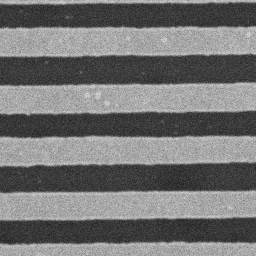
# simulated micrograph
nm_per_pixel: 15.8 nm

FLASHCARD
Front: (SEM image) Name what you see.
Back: lines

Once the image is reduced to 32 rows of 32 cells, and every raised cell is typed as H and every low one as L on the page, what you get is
LLLLLLLLLLLLLLLLLLLLLLLLLLLLLLLL
LLLLLLLLLLLLLLLLLLLLLLLLLLLLLLLL
LLLLLLLLLLLLLLLLLLLLLLLLLLLLLLLL
LLLLLLLLLLLLLHLHLLLLLHHHHLLHHHLH
HHHHHHHHHHHHHHHHHHHHHHHHHHHHHHHH
HHHHHHHHHHHHHHHHHHHHHHHHHHHHHHHH
HHHHHHHHHHHHHHHHHHHHHHHHHHHHHHHH
LLLLLLLLLLLLLLLLLLLLLLLLLLLLLLLL
LLLLLLLLLLLLLLLLLLLLLLLLLLLLLLLL
LLLLLLLLLLLLLLLLLLLLLLLLLLLLLLLL
LLLLLLLLLLLLLLLLLLLLLLLLLLLLLHHH
HHHHHHHHHHHHHHHHHHHHHHHHHHHHHHHH
HHHHHHHHHHHHHHHHHHHHHHHHHHHHHHHH
HHHHHHHHHHHHHHHHHHHHHHHHHHHHHHHH
LLLLLLLLLLLLLLLLLLLLLLLLLLLLLLLL
LLLLLLLLLLLLLLLLLLLLLLLLLLLLLLLL
LLLLLLLLLLLLLLLLLLLLLLLLLLLLLLLL
HHHHHHHHHHHHHHHHHHHHHHHHHHHHHHHH
HHHHHHHHHHHHHHHHHHHHHHHHHHHHHHHH
HHHHHHHHHHHHHHHHHHHHHHHHHHHHHHHH
HHHHHHHHHHHHHHLLLLHHLLLLLLLLLLLL
LLLLLLLLLLLLLLLLLLLLLLLLLLLLLLLL
LLLLLLLLLLLLLLLLLLLLLLLLLLLLLLLL
LLLLLLLLLLLLLLLLLLLLLLLLLLLLLLLL
HHHHHHHHHHHHHHHHHHHHHHHHHHHHHHHH
HHHHHHHHHHHHHHHHHHHHHHHHHHHHHHHH
HHHHHHHHHHHHHHHHHHHHHHHHHHHHHHHH
LLLLLLLLLLLLLLLLLLLLLLLLLLLLLLLL
LLLLLLLLLLLLLLLLLLLLLLLLLLLLLLLL
LLLLLLLLLLLLLLLLLLLLLLLLLLLLLLLL
LLLLLLLLLLLHHHLLHHHHHHHHHHHHHHHH
HHHHHHHHHHHHHHHHHHHHHHHHHHHHHHHH